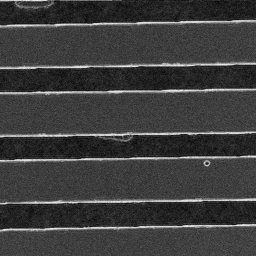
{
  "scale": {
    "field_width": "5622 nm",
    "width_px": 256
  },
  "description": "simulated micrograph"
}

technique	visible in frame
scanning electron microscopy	lines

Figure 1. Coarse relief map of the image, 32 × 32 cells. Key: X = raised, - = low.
--------------------------------
--------------------------------
--------------------------------
XXXXXXXXXXXXXXXXXXXXXXXXXXXXXXXX
XXXXXXXXXXXXXXXXXXXXXXXXXXXXXXXX
XXXXXXXXXXXXXXXXXXXXXXXXXXXXXXXX
XXXXXXXXXXXXXXXXXXXXXXXXXXXXXXXX
XXXXXXXXXXXXXXXXXXXXXXXXXXXXXXXX
XXXXX---------------------------
--------------------------------
--------------------------------
-------------XXXXXXXXXXXXXXXXXXX
XXXXXXXXXXXXXXXXXXXXXXXXXXXXXXXX
XXXXXXXXXXXXXXXXXXXXXXXXXXXXXXXX
XXXXXXXXXXXXXXXXXXXXXXXXXXXXXXXX
XXXXXXXXXXXXXXXXXXXXXXXXXXXXXXXX
XXXXXXXXXXXXXXXXXXXXXXXXXXXXXXXX
--------------------------------
--------------------------------
--------------------------------
XXXXXXXXXXXXXXXXXXXXXXXXXXXXXXXX
XXXXXXXXXXXXXXXXXXXXXXXXXXXXXXXX
XXXXXXXXXXXXXXXXXXXXXXXXXXXXXXXX
XXXXXXXXXXXXXXXXXXXXXXXXXXXXXXXX
XXXXXXXXXXXXXXXXXXXXXXXXXXXXXXXX
--------------------------------
--------------------------------
--------------------------------
-----------XXXXXXXXXXXXXXXXXXXXX
XXXXXXXXXXXXXXXXXXXXXXXXXXXXXXXX
XXXXXXXXXXXXXXXXXXXXXXXXXXXXXXXX
XXXXXXXXXXXXXXXXXXXXXXXXXXXXXXXX